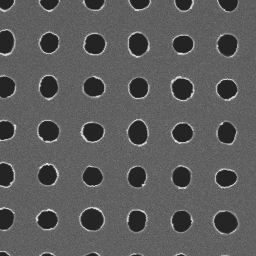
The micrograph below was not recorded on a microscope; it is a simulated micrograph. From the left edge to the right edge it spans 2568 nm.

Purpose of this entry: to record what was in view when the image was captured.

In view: a regular array of holes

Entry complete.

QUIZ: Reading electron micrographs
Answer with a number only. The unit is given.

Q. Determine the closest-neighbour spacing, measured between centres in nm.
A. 441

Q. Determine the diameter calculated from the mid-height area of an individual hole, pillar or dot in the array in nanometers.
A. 196